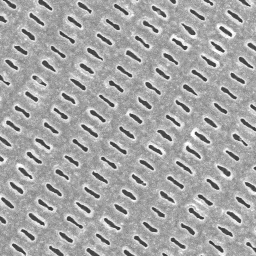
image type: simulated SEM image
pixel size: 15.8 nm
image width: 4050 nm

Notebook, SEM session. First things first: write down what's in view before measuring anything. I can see a regular array of holes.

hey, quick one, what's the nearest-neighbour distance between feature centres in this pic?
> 0.271 µm